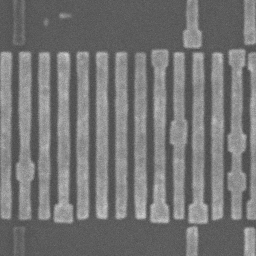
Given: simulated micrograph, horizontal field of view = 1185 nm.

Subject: wiring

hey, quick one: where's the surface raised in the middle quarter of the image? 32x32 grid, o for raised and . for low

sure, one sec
o..ooo..ooo..ooo..oo..oooo..oo..
o..ooo..ooo..ooo..oo...oo...oo..
o...oo..ooo..ooo..oo...oo...oo..
o...oo..ooo..ooo..oo...oo...oo..
o...oo..ooo..ooo..oo...oo...oo..
o...oo..ooo..ooo..oo...oo...oo..
o...oo..ooo..ooo..oo...oo...oo..
o...oo..ooo..ooo..oo...oo...oo..
o...oo..ooo..ooo..oo...oo...oo..
o...oo..ooo..ooo..oo...oo...oo..
o...oo..ooo..ooo..oo...oo...oo..
o...oo..ooo..ooo..oo...oo...oo..
o...oo..ooo..ooo..oo...oo...oo..
o...oo..ooo..ooo..oo...oo...oo..
o..ooo..ooo..ooo..oo...oo..oooo.
o..ooo..ooo..ooo..oo...oo..oooo.
o..ooo..ooo..ooo..oo...oo..oooo.
o..ooo..ooo..ooo..oo...oo..oooo.
o..ooo..ooo..oo...oo...oo..ooo..
o..ooo..ooo..ooo..oo...oo..ooo..
o..ooo..ooo..ooo..oo...oo...oo..
o..ooo..ooo..ooo..oo...oo...oo..
o..ooo..ooo..ooo..oo...oo...oo..
o..ooo..ooo..ooo..oo...oo..ooo..
o...oo..ooo..ooo..oo...oo..ooo..
o...oo..ooo..ooo..oo...oo..ooo..
o..ooo..ooo..ooo..oo...oo...oo..
o..ooo..ooo..ooo..oo...oo...oo..
o..ooo..ooo..oo...oo...oo...oo..
o..ooo..ooo..ooo..oo...oo...oo..
o...oo..ooo..ooo..oo...oo...oo..
o...oo..ooo..ooo..oo...oo...oo..